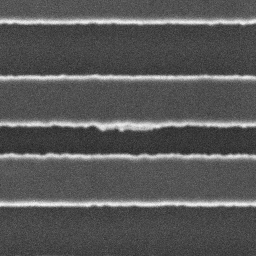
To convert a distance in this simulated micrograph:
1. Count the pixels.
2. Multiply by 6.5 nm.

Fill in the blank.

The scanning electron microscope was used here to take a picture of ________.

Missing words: lines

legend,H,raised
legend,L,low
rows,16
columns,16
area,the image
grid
HHHHHHHHHHHHHHHH
LLLLLLLLLLLLLLLL
LLLLLLLLLLLLLLLL
LLLLLLLLLLLLLLLL
LLLLLLLLLLLLLLLL
HHHHHHHHHHHHHHHH
HHHHHHHHHHHHHHHH
HHHHHHHHHHHHHHHH
LLLLLLLLLLLLLLLL
LLLLLLLLLLLLLLLL
HHHHHHHHHHHHHHHH
HHHHHHHHHHHHHHHH
HHHHHHHHHHHHHHHH
LLLLLLLLLLLLLLLL
LLLLLLLLLLLLLLLL
LLLLLLLLLLLLLLLL